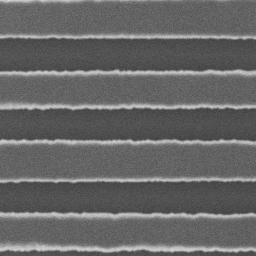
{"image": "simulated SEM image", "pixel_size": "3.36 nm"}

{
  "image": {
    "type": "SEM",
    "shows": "lines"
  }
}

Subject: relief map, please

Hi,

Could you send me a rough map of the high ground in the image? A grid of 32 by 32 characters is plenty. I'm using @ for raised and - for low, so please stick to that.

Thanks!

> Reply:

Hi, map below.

@@@@@@@@@@@@@@@@@@@@@@@@@@@@@@@@
@@@@@@@@@@@@@@@@@@@@@@@@@@@@@@@@
@@@@@@@@@@@@@@@@@@@@@@@@@@@@@@@@
@@@@@@@@@@@@@@@@@@@@@@@@@@@@@@@@
@@@@@@@@@@@@@@@@@@@@@@@@@@@@@@@@
--------------------------------
--------------------------------
--------------------------------
--------------------------------
@@@@@@@@@@@@@@@@@@@@@@@@@@@@@@@@
@@@@@@@@@@@@@@@@@@@@@@@@@@@@@@@@
@@@@@@@@@@@@@@@@@@@@@@@@@@@@@@@@
@@@@@@@@@@@@@@@@@@@@@@@@@@@@@@@@
@@-@-@--@@-@@@@----@@@-@---@-@--
--------------------------------
--------------------------------
--------------------------------
--------------------------------
@@@@@@@@@@@@@@@@@@@@@@@@@@@@@@@@
@@@@@@@@@@@@@@@@@@@@@@@@@@@@@@@@
@@@@@@@@@@@@@@@@@@@@@@@@@@@@@@@@
@@@@@@@@@@@@@@@@@@@@@@@@@@@@@@@@
@@@@@@@@@@@@@@@@@@@@@@@@@@@@@@@@
--------------------------------
--------------------------------
--------------------------------
--------------------------------
@@@@@@@@@@@@@@@@@@@@@@@@@@@@@@@@
@@@@@@@@@@@@@@@@@@@@@@@@@@@@@@@@
@@@@@@@@@@@@@@@@@@@@@@@@@@@@@@@@
@@@@@@@@@@@@@@@@@@@@@@@@@@@@@@@@
--------------------------------